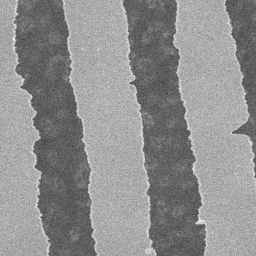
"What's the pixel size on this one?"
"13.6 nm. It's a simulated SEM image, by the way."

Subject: one or a few lines or trenches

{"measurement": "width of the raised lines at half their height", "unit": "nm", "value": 792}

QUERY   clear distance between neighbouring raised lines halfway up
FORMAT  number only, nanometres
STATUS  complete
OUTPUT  672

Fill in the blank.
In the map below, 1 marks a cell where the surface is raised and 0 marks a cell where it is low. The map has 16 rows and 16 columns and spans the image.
1000111100011100
1000111100011100
1000111100011110
1000111100011110
1000111100011110
1100011100011110
1100011110011110
1100011110001110
1100011110001110
1100011110001111
1100001110001111
1100001110001111
1100001110000111
1110001110001111
1110001110000111
1110001111000111